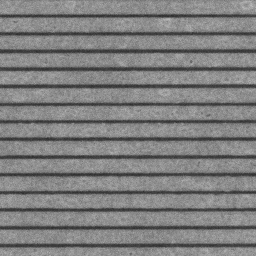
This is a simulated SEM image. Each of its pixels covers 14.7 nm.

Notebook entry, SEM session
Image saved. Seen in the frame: parallel lines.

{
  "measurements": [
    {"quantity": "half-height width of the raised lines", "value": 196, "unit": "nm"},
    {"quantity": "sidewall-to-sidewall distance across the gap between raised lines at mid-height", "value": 64.2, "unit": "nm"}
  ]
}